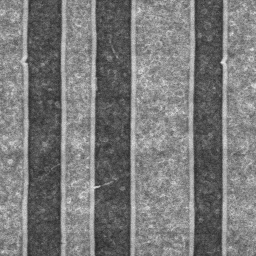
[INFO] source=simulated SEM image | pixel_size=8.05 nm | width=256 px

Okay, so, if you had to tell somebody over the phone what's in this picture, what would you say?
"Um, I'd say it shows one or a few lines or trenches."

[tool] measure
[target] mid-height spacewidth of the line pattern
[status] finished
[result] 298 nm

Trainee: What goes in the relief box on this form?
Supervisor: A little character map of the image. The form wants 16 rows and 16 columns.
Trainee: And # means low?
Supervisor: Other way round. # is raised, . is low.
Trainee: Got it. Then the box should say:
##..##..####..##
##..##..####..##
##..##..####..##
##..##..####..##
##..##..####..##
##..##..####..##
##..##..####..##
##..##..####..##
##..##..####..##
##..##..####..##
##..##..####..##
##..##..####..##
##..##..####..##
##..##..####..##
##..##..####..##
##..##..####..##